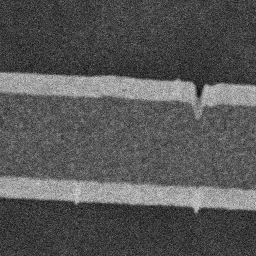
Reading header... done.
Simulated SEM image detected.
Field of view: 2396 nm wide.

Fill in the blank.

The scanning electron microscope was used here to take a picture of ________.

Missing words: one or a few lines or trenches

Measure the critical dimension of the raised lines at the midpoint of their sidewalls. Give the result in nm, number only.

980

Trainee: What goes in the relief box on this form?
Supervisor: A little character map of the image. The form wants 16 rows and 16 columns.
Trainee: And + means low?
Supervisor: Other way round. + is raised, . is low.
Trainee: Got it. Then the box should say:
................
................
................
................
................
++++++++........
++++++++++++++++
++++++++++++++++
++++++++++++++++
++++++++++++++++
++++++++++++++++
++++++++++++++++
................
................
................
................